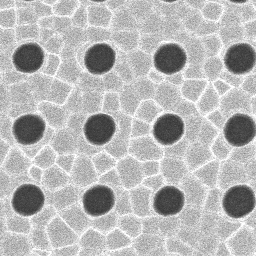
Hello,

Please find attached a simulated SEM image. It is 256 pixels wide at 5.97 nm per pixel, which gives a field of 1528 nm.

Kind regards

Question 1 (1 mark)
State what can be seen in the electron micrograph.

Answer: a regular array of holes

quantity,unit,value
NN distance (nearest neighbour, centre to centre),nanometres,419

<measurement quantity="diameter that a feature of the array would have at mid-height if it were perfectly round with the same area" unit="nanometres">177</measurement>